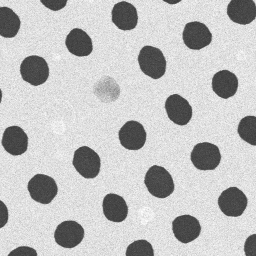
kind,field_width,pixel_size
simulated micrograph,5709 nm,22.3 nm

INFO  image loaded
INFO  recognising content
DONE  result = a regular array of holes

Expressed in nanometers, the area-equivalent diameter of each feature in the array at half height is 641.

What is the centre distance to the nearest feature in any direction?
1.18 microns